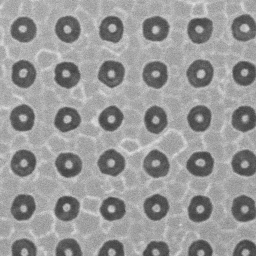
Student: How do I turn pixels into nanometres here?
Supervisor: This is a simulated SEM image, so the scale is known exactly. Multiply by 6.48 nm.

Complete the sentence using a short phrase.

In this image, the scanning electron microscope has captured a regular array of ring-shaped grooves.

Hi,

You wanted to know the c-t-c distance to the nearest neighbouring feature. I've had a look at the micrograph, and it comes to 284 nm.